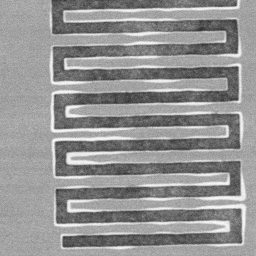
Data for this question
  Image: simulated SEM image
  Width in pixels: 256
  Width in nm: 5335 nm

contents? groups of lines, slits or small figures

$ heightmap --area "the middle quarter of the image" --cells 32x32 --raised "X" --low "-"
XXXXXXXXXXXXXXXXXXXXXXXXXXXXXXXX
--------------------------------
--------------------------------
--------------------------------
------XXXXXXXXXXXXXXXXXXXXXXXXXX
XXXXXXXXXXXXXXXXXXXXXXXXXXXXXXXX
XXXXXXXXXXXXXXXXXXXXXX----------
--------------------------------
--------------------------------
--------------------------------
----XXXXXXXXXXXXXXXXXXXXXXXXXXXX
-XXXXXXXXXXXXXXXXXXXXXXXXXXXXXXX
-XXXXXXXXXXXXXXXXXXXXXX---------
--------------------------------
--------------------------------
--------------------------------
------------XXXXXXXXXXXXXXXXXXXX
XXXXXXXXXXXXXXXXXXXXXXXXXXXXXXXX
XXXXXXXXXXXX---XXXXXXXXXXXXXXX--
--------------------------------
--------------------------------
--------------------------------
--------XXXXXXXXXXXXXXXXXXXXXXXX
-XXXXXXXXXXXXXXXXXXXXXXXXXXXXXXX
-XXXXXXXXXXXXXXXXXXXXXXXXXXX----
--------------------------------
--------------------------------
--------------------------------
XXXXXXXXXXXXXXXXXXXXXXXXXXXXXXXX
XXXXXXXXXXXXXXXXXXXXXXXXXXXXXXXX
XXXXXXXXXXXXXXXXXXX-------------
--------------------------------